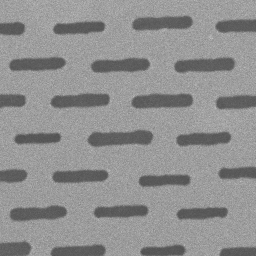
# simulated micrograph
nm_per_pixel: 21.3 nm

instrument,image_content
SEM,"a regular array of holes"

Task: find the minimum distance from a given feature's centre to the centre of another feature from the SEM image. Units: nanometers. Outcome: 1170